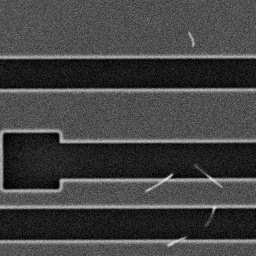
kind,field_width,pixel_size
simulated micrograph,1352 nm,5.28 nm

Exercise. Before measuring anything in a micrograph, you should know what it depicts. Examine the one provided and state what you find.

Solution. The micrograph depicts groups of lines, slits or small figures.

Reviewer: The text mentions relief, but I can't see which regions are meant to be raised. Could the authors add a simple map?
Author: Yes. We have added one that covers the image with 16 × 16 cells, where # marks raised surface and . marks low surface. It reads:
################
################
################
################
................
................
################
################
....############
................
................
....############
################
................
................
################